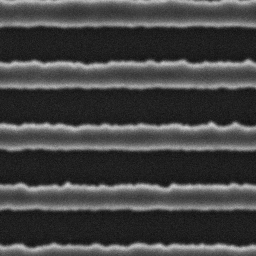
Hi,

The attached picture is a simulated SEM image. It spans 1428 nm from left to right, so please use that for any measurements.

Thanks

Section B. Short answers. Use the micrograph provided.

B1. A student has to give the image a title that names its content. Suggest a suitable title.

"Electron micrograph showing lines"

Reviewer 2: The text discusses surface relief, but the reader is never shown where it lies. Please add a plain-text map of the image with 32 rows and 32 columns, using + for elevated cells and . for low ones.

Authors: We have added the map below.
++++++++++++++++++++++++++++++++
++++++++++++++++++++++++++++++++
++++++++++++++++++++++++++++++++
................................
................................
................................
................................
................................
++++++++++++++++++++++++++++++++
++++++++++++++++++++++++++++++++
++++++++++++++++++++++++++++++++
................................
................................
................................
................................
..........................+..+..
++++++++++++++++++++++++++++++++
++++++++++++++++++++++++++++++++
+++.++++++++++++++++++++++++++++
................................
................................
................................
................................
++++++++++++++++++++.+++++++++++
++++++++++++++++++++++++++++++++
++++++++++++++++++++++++++++++++
................................
................................
................................
................................
.................+..............
++++++++++++++++++++++++++++++++